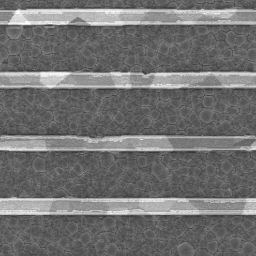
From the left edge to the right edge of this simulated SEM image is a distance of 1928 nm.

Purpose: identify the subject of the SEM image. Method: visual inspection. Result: one or a few lines or trenches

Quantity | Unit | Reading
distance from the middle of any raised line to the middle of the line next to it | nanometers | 474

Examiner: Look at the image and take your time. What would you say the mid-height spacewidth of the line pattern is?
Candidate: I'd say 0.381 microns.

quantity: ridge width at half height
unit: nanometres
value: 98.8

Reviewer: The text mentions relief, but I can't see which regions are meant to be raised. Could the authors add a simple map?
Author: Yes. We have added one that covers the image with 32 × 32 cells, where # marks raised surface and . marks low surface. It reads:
................................
################################
################################
................................
................................
................................
................................
................................
................................
################################
################################
................................
................................
................................
................................
................................
................................
################################
################################
................................
................................
................................
................................
................................
................................
################################
################################
................................
................................
................................
................................
................................